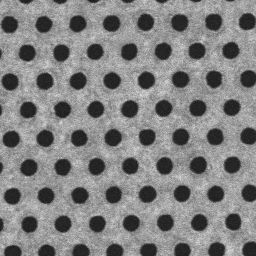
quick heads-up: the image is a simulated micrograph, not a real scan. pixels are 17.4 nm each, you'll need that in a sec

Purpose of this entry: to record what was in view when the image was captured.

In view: a regular array of holes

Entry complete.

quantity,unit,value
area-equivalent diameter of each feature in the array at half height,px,17.2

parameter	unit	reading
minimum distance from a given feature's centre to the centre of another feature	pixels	32.8